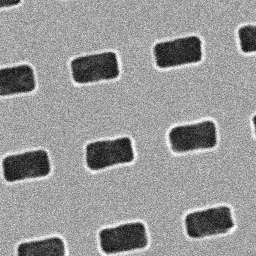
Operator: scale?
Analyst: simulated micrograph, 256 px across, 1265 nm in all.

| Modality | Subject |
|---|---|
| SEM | holes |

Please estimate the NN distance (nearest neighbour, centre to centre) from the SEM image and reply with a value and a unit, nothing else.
417 nm